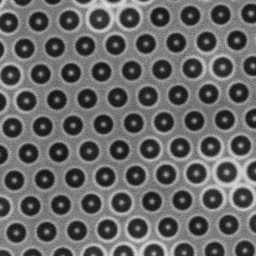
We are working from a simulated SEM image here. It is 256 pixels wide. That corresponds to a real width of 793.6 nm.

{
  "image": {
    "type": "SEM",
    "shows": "an array of small figures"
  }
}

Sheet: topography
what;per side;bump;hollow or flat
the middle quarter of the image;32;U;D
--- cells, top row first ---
DDDDUUUDDDDDUUUDDDDUUUDDDDDUUUDD
DDDDUUUDDDDDUUDDDDDDUUDDDDDUUUDD
DDDDUUUDDDDDUUUDDDDUUUDDDDDUUUDD
DDDDUUUDDDDUUUUDDDDUUUUDDDUUUUUD
UDDUUUUUUDUUUUUUUUUUUUUUUUUUUUUU
UUUUUUUUUUUUUUUUUUUUUUUUUUUUDDUU
UUUUDDDUUUUUDDDUUUUDDDDUUUDDDDDU
UUUUDDDDUUUDDDDDUUUDDDDDUUDDDDDU
DUUDDDDDUUUDDDDDUUDDDDDDUUDDDDDU
DUUDDDDDUUUDDDDDUUUDDDDUUUUDDDDU
UUUUDDDUUUUUDDDUUUUUDDUUUUUUUUUU
UUUUUUUUUUUUUUUUUUUUUUUUUUUUUUUU
UUUUUUUUUDUUUUUUDDDUUUUDDDUUUUUD
UDDDUUUUDDDDUUUDDDDDUUDDDDDUUUDD
DDDDDUUDDDDDUUUDDDDDUUDDDDDDUUDD
DDDDDUUDDDDDUUUDDDDDUUDDDDDUUUDD
DDDDDUUUDDDDUUUDDDDUUUUDDDDUUUUD
UDDDUUUUUDDUUUUUUUUUUUUUUUUUUUUU
UUUUUUUUUUUUUUUUUUUUUDUUUUUUDDUU
UUUUUDDUUUUUDDDUUUUUDDDDUUUDDDDU
DUUUDDDDDUUDDDDDUUUDDDDDUUDDDDDD
DUUUDDDDDUUDDDDDUUUDDDDDUUDDDDDD
DUUUDDDDDUUUDDDDUUUDDDDDUUUDDDDU
DUUUDDDDUUUUDDDUUUUUDDDUUUUUDDUU
UUUUUUDUUUUUUUUUUUUUUUUUUUUUUUUU
UUUUUUUUUUUUUUUUUDDUUUUUDDDUUUUD
UDDDUUUUDDDDUUUUDDDDUUUDDDDDUUUD
DDDDDUUUDDDDDUUDDDDDDUUDDUDDUUDD
DDDDDDUUDDDDDUUDDDDDDUUDDDDDUUUD
DDDDDUUUDDDDDUUUDDDDUUUUDDDUUUUD
UDDDUUUUUDDDUUUUUDDUUUUUUUUUUUUU
UUUUUUUUUUUUUUUUUUUUUUUUUUUUUDUU